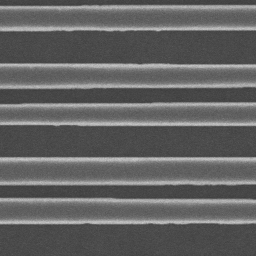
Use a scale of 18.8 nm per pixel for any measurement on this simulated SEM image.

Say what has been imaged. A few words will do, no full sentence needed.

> lines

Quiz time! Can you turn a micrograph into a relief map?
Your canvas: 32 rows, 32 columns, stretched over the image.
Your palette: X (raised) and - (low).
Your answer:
--------------------------------
XXXXXXXXXXXXXXXXXXXXXXXXXXXXXXXX
XXXXXXXXXXXXXXXXXXXXXXXXXXXXXXXX
XXXXXXXXXXXXXXXXXXXXXXXXXXXXXXXX
--------------------------------
--------------------------------
--------------------------------
--------------------------------
XXXXXXXXXXXXXXXXXXXXXXXXXXXXXXXX
XXXXXXXXXXXXXXXXXXXXXXXXXXXXXXXX
XXXXXXXXXXXXXXXXXXXXXXXXXXXXXXXX
--------------------------------
--------------------------------
XXXXXXXXXXXXXXXXXXXXXXXXXXXXXXXX
XXXXXXXXXXXXXXXXXXXXXXXXXXXXXXXX
XXXXXXXXXXXXXXXXXXXXXXXXXXXXXXXX
--------------------------------
--------------------------------
--------------------------------
--------------------------------
XXXXXXXXXXXXXXXXXXXXXXXXXXXXXXXX
XXXXXXXXXXXXXXXXXXXXXXXXXXXXXXXX
XXXXXXXXXXXXXXXXXXXXXXXXXXXXXXXX
--------------------------------
--------------------------------
XXXXXXXXXXXXXXXXXXXXXXXXXXXXXXXX
XXXXXXXXXXXXXXXXXXXXXXXXXXXXXXXX
XXXXXXXXXXXXXXXXXXXXXXXXXXXXXXXX
--------------------------------
--------------------------------
--------------------------------
--------------------------------